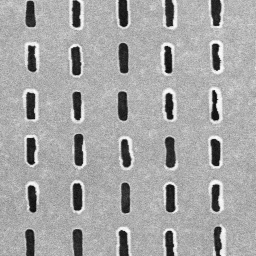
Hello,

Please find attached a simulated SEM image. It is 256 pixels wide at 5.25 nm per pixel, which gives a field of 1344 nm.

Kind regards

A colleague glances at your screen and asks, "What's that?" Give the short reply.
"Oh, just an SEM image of a regular array of holes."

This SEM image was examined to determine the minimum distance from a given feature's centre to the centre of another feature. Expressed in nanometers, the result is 235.